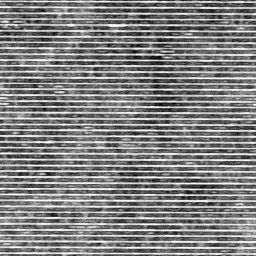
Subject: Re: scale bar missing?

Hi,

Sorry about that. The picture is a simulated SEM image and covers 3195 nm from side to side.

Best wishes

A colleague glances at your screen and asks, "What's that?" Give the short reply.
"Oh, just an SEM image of parallel lines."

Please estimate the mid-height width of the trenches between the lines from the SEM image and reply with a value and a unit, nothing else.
0.0561 micrometres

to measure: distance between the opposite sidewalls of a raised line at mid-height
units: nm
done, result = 18.7